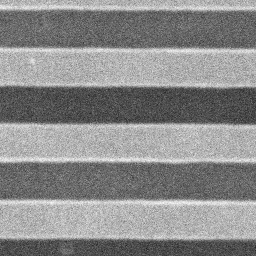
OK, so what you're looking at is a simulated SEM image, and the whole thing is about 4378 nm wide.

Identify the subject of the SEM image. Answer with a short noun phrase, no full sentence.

lines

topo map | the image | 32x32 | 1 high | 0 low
11111111111111111111111111111111
00000000000000000000000000000000
00000000000000000000000000000000
00000000000000000000000000000000
00000000000000000000000000000000
00000000000000000000000000000000
11111111111111111111111111111111
11111111111111111111111111111111
11111111111111111111111111111111
11111111111111111111111111111111
10111111111111111111111111111111
00000000000000000000000000000000
00000000000000000000000000000000
00000000000000000000000000000000
00000000000000000000000000000000
00000000000000000000000000000000
11111111111111111111111111111111
11111111111111111111111111111111
11111111111111111111111111111111
11111111111111111111111111111111
00000000000000000000000000000000
00000000000000000000000000000000
00000000000000000000000000000000
00000000000000000000000000000000
00000000000000000000000000000000
11111111111111111111111111111111
11111111111111111111111111111111
11111111111111111111111111111111
11111111111111111111111111111111
11111111111111111111111111111111
00000000000000000000000000000000
00000000000000000000000000000000